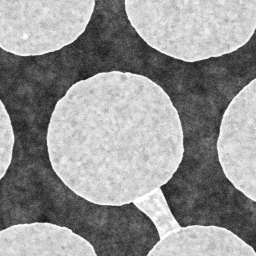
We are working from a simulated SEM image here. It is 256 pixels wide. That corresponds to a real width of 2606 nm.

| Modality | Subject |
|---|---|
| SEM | raised bodies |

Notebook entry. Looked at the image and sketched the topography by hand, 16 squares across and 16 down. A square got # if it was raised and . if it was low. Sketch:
######..########
#####...########
#####....######.
...........###..
................
....######.....#
....#######...##
#..########...##
#..########...##
#..########...##
...########...##
....######.....#
.....#####......
.........##.....
#####.....####..
######....######